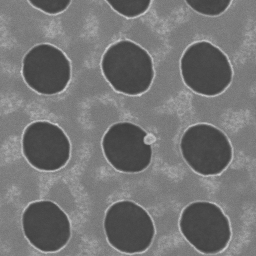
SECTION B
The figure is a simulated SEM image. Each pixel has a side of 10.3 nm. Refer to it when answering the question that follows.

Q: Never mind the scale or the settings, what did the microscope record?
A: a regular array of holes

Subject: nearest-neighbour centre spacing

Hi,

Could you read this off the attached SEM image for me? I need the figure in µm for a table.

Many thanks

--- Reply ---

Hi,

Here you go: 0.802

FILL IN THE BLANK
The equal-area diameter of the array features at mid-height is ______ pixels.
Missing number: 49.3